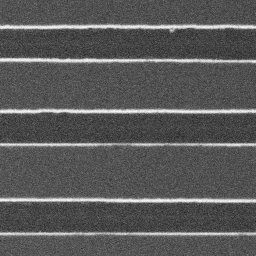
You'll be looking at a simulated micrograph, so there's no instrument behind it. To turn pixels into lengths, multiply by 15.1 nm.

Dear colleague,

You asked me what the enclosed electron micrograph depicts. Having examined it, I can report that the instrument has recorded lines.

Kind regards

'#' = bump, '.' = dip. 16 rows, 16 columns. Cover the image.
################
################
................
................
################
################
################
................
................
################
################
################
..#...##########
................
................
################